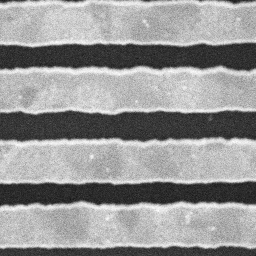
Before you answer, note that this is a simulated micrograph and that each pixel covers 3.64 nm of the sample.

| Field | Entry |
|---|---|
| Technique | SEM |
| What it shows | lines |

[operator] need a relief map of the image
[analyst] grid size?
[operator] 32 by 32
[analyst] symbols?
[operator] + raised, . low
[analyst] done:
+++++++++++++++++++++++++++++.++
++++++++++++++++++++++++++++++++
++++++++++++++++++++++++++++++++
++++++++++++++++++++++++++++++++
++++++++++++++++++++++++++++++++
++++++++..++...+.+++++++..++....
................................
................................
.................++........+....
++++++++++++++++++++++++++++++++
++++++++++++++++++++++++++++++++
++++++++++++++++++++++++++++++++
++++++++++++++++++++++++++++++++
++++++++++++++++++++++++++++++++
................................
................................
................................
.............++......+...+++.++.
++++++++++++++++++++++++++++++++
++++++++++++++++++++++++++++++++
++++++++++++++++++++++++++++++++
++++++++++++++++++++++++++++++++
++++++++++++++++++++++++++++++++
................................
................................
.........+++.....++..++++++.++..
++++++++++++++++++++++++++++++++
++++++++++++++++++++++++++++++++
++++++++++++++++++++++++++++++++
++++++++++++++++++++++++++++++++
++++++++++++++++++++++++++++++++
................................